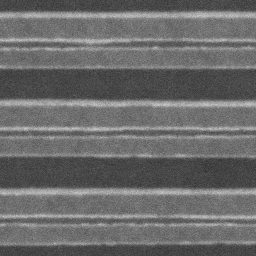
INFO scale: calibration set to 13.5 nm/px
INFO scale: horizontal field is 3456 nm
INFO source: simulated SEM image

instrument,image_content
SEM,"lines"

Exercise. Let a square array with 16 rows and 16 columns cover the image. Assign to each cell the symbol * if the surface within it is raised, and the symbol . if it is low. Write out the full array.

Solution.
................
****************
****************
****************
................
................
**********......
****************
****************
****************
................
................
****************
****************
****************
................